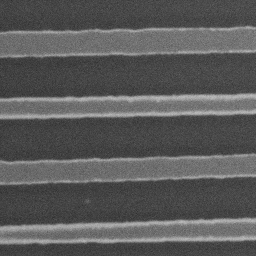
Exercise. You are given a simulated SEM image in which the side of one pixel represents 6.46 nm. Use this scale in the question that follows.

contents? lines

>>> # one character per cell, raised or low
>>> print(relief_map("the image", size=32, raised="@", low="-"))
--------------------------------
--------------------------------
--------------------------------
-------------------------@---@@@
@@@@@@@@@@@@@@@@@@@@@@@@@@@@@@@@
@@@@@@@@@@@@@@@@@@@@@@@@@@@@@@@@
@@@@@@@@@@@@@@@@@@@@@@@@@@------
--------------------------------
--------------------------------
--------------------------------
--------------------------------
--------------------------------
@@@@@@@@@@@@@@@@@@@@@@@@@@@@@@@@
@@@@@@@@@@@@@@@@@@@@@@@@@@@@@@@@
@@@@@@@@@@@@@@@-----------------
--------------------------------
--------------------------------
--------------------------------
--------------------------------
--------------------------@@@@@@
@@@@@@@@@@@@@@@@@@@@@@@@@@@@@@@@
@@@@@@@@@@@@@@@@@@@@@@@@@@@@@@@@
@@@@@@@@@@@@@@@-----------------
--------------------------------
--------------------------------
--------------------------------
--------------------------------
---------------------------@@@@@
@@@@@@@@@@@@@@@@@@@@@@@@@@@@@@@@
@@@@@@@@@@@@@@@@@@@@@@@@@@@@@@@@
--------------------------------
--------------------------------